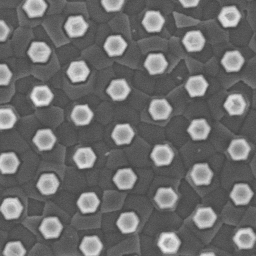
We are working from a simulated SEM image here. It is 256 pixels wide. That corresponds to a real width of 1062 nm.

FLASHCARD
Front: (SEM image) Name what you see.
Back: a regular array of raised bodies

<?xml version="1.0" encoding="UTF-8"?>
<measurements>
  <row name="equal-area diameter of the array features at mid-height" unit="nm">84.8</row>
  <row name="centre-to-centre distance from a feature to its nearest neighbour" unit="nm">181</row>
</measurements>